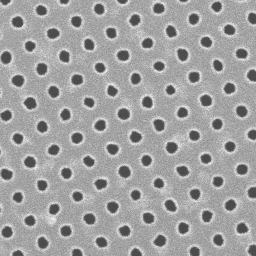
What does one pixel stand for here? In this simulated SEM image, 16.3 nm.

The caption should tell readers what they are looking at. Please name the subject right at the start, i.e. a regular array of holes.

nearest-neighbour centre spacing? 25.7 pixels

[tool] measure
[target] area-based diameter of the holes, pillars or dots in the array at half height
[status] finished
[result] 188 nm